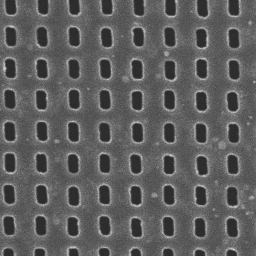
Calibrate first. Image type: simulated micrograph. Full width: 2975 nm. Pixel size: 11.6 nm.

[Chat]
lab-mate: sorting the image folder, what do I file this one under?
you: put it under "a regular array of holes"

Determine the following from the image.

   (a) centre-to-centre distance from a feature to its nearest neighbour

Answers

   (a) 0.358 micrometres